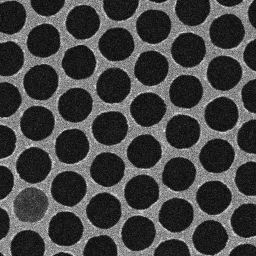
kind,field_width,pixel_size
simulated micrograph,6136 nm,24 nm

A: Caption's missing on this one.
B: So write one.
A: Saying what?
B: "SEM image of a regular array of holes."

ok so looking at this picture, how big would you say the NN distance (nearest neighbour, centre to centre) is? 986 nanometers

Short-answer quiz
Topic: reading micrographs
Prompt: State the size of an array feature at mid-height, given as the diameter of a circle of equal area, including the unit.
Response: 0.843 um